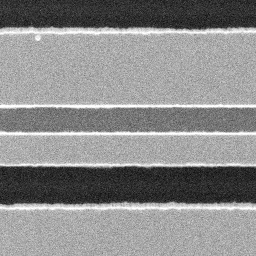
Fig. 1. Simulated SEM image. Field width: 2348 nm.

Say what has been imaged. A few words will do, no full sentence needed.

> lines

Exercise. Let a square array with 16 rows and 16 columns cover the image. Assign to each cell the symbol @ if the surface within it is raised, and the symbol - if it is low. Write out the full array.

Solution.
----------------
----------------
@@@@@@@@@@@@@@@@
@@@@@@@@@@@@@@@@
@@@@@@@@@@@@@@@@
@@@@@@@@@@@@@@@@
@@@@@@@@@@@@@@@@
@@@@@@@@@@@@@@@@
@@@@@@@@@@@@@@@@
@@@@@@@@@@@@@@@@
----------------
----------------
----------------
@@@@@@@@@@@@@@@@
@@@@@@@@@@@@@@@@
@@@@@@@@@@@@@@@@